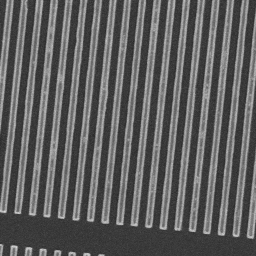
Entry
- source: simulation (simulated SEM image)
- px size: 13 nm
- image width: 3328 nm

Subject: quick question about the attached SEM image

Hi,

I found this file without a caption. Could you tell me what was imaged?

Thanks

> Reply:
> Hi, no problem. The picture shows parallel lines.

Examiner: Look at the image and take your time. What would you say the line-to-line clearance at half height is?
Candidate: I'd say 128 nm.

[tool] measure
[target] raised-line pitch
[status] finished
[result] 0.19 micrometres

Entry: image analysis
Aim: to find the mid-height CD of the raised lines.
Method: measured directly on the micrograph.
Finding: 58.2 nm